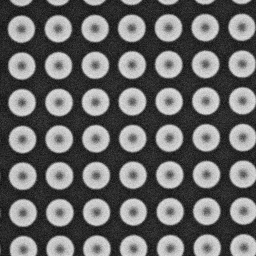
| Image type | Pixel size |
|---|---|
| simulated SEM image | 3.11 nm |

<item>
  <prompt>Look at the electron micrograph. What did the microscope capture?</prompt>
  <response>an array of small figures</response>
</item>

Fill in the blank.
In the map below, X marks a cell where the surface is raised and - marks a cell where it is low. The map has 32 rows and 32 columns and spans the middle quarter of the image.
XX---XXXXXX---XXXXXX---XXXXXX---
XX---XXXXXX---XXXXXX---XXXXXX---
X----XXXXX----XXXXXX----XXXXX---
-------XX-------XX--------------
--------------------------------
--------------------------------
------XXX------XXXX-----XXXX----
X----XXXXXX---XXXXXX---XXXXXX---
XX---XXXXXX---XXXXXX---XXXXXXX--
XX---XXXXXX---XXXXXX---XXXXXXX--
XX---XXXXXX---XXXXXX---XXXXXX---
X----XXXXXX---XXXXXX----XXXXX---
X-----XXX-------XXX------XX-----
--------------------------------
--------------------------------
-------XX-------XX-------XXX----
X----XXXXXX----XXXXX----XXXXX---
XX---XXXXXX---XXXXXX---XXXXXXX--
XX---XXXXXX---XXXXXX---XXXXXXX--
XX---XXXXXX---XXXXXX---XXXXXXX--
XX---XXXXXX---XXXXXX----XXXXX---
X-----XXXX-----XXXX------XXX----
--------------------------------
--------------------------------
--------------------------X-----
X-----XXXX-----XXXXX----XXXXX---
XX---XXXXXX---XXXXXX---XXXXXXX--
XX---XXXXXX---XXXXXXX--XXXXXXX--
XX---XXXXXX---XXXXXXX--XXXXXXX--
XX---XXXXXX---XXXXXX----XXXXX---
X-----XXXX-----XXXX-----XXXX----
--------------------------------